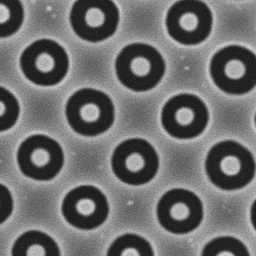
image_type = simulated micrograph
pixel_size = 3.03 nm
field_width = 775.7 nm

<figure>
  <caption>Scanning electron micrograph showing a regular array of ring-shaped grooves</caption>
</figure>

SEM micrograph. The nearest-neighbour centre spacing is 203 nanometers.